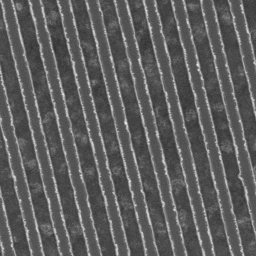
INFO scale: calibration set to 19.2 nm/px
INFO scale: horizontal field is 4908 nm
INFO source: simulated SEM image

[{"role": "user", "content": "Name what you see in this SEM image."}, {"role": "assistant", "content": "parallel lines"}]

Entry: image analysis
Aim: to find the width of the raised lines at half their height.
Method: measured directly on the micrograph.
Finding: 243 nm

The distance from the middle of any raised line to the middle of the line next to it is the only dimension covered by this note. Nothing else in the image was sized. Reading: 533 nm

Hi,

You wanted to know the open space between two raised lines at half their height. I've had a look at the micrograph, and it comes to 292 nm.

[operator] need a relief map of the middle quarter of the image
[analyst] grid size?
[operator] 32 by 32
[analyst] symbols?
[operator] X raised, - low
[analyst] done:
--XXX----XXX----XXX-----XXX----X
--XXXX---XXXX----XXX----XXX----X
---XXX----XXX----XXX----XXX----X
---XXX----XXX----XXX----XXX----X
---XXX----XXXX---XXXX----XXX----
---XXX----XXXX----XXX----XXX----
----XXX----XXX----XXX----XXX----
----XXX----XXX----XXX----XXX----
----XXX----XXX----XXX----XXXX---
----XXX----XXXX----XXX----XXX---
X----XXX----XXX----XXX----XXX---
X----XXX----XXX----XXX----XXX---
X----XXX----XXX----XXXX---XXXX--
X----XXX----XXXX---XXXX---XXXX--
XX---XXXX----XXX----XXX----XXX--
XX----XXX----XXX----XXX----XXX--
XX----XXX----XXX----XXX----XXX--
XX----XXX----XXX----XXXX----XXX-
XX----XXXX---XXXX----XXX----XXX-
XXX----XXX----XXX----XXX----XXX-
XXX----XXX----XXX----XXX----XXXX
XXX----XXX----XXX----XXXX----XXX
XXX----XXX----XXXX----XXX----XXX
XXXX----XXX----XXX----XXX----XXX
-XXX----XXX----XXX----XXX----XXX
-XXX----XXX----XXX----XXXX---XXX
-XXX----XXX----XXXX----XXX----XX
-XXXX----XXX----XXX----XXX----XX
--XXX----XXX----XXX----XXX----XX
--XXX----XXX----XXX----XXX----XX
--XXX----XXX----XXXX---XXXX----X
--XXX----XXXX---XXXX----XXX----X